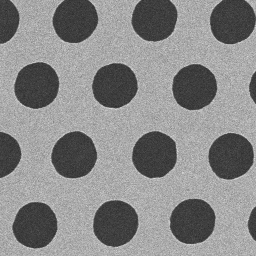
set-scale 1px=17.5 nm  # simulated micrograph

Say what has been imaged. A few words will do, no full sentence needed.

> a regular array of holes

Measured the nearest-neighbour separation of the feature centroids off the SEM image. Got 1.37 um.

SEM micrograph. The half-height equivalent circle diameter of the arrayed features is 803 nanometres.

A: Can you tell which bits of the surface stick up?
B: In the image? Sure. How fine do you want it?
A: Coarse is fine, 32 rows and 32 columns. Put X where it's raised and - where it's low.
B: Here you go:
--XXXXXX----XXXXX-----XXXXX----X
--XXXXX-----XXXXX-----XXXXX-----
--XXXXX-----XXXX------XXXX------
--XXXXX-----XXXXX-----XXXX------
--XXXXX----XXXXXX----XXXXXX----X
XXXXXXXXXXXXXXXXXXXXXXXXXXXX-XXX
XXXXXXXXXXXXXXXXXXXXXXXXXXXXXXXX
XXXXXXXXXXXXXXXXXXXXXXXXXXXXXXXX
XXX----XXXXXX---XXXXXXX---XXXXXX
XX-----XXXXX-----XXXXX-----XXXXX
XX-----XXXXX-----XXXXX-----XXXX-
XX-----XXXXX-----XXXXX-----XXXX-
XX-----XXXXX----XXXXXX-----XXXXX
XXXX-XXXXXXXXX-XXXXXXXX--XXXXXXX
XXXXXXXXXXXXXXXXXXXXXXXXXXXXXXXX
XXXXXXXXXXXXXXXXXXXXXXXXXXXXXXXX
XXXXXXXXX-XXXXXXXXX-XXXXXXXXXXXX
--XXXXX----XXXXXX-----XXXXX----X
--XXXXX-----XXXXX-----XXXX------
---XXX------XXXX------XXXX------
--XXXXX-----XXXXX-----XXXX------
-XXXXXX----XXXXXX----XXXXXX----X
XXXXXXXXXXXXXXXXXXXXXXXXXXXX-XXX
XXXXXXXXXXXXXXXXXXXXXXXXXXXXXXXX
XXXXXXXXXXXXXXXXXXXXXXXXXXXXXXXX
XXX---XXXXXXX---XXXXXX----XXXXXX
XX-----XXXXX-----XXXXX-----XXXX-
XX-----XXXXX-----XXXX------XXXX-
XX-----XXXXX-----XXXX------XXXX-
XX-----XXXXX-----XXXXX----XXXXX-
XXX---XXXXXXX---XXXXXXXXXXXXXXXX
XXXXXXXXXXXXXXXXXXXXXXXXXXXXXXXX